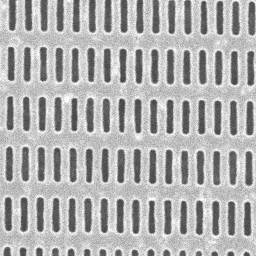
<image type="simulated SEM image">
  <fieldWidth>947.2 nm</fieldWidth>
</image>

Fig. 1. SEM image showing a regular array of holes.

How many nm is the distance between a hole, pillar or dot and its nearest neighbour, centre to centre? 58.8